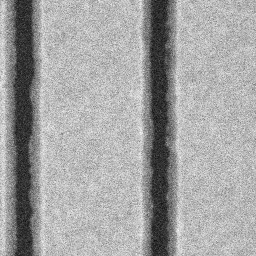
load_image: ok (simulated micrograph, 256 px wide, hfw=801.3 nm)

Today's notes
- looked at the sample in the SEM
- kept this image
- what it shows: one or a few lines or trenches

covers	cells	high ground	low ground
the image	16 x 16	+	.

..+++++++..+++++
..+++++++..+++++
..+++++++..+++++
..+++++++..+++++
...++++++..+++++
..+++++++..+++++
..+++++++..+++++
..+++++++..+++++
..+++++++..+++++
..+++++++..+++++
..+++++++..+++++
..+++++++..+++++
..+++++++..+++++
..+++++++..+++++
..+++++++..+++++
..+++++++..+++++